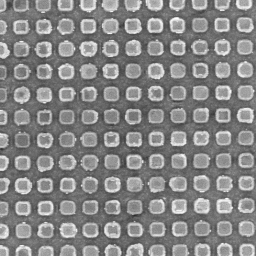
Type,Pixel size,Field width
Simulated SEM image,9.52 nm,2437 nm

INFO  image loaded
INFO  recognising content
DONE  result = a regular array of raised bodies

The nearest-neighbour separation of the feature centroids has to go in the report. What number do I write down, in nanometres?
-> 211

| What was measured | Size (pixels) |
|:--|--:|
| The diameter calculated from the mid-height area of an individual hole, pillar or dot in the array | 15.1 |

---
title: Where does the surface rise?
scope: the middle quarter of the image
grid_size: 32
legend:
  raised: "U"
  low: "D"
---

UUDDDUUUDDUUUDDDUUUDDUUUDDDUUUDD
UUDDDUUUDDUUUDDDUUUDDUUUUDDUUUDD
UUDDDUUUDDUUUUDDUUUDDUUUUDDUUUDD
UDDDDDDDDDDDUDDDDDDDDDUUDDDDDDDD
DDDDDDDDDDDDDDDDDDDDDDDDDDDDDDDD
DDDDDDDDDDDDDDDDDDDDDDDDDDDDDDDD
UUDDDUUUDDUUUUDDUUUDDUUUUDDUUUDD
UUDDDUUUDDUUUUDDUUUDDUUUUDDUUUDD
UUDDDUUUDDUUUUDDUUUDDUUUUDDUUUDD
DDDDDDDDDDDDDDDDDDDDDDDDDDDDDDDD
DDDDDDDDDDDDDDDDDDDDDDDDDDDDDDDD
DDDDDDDDDDDDDDDDUUUDDDUUDDDUUUDD
UUDDDUUUDDUUUUDUUUUDDUUUUDDUUUDD
UUDDDUUUDDUUUUDUUUUDDUUUUDDUUUDD
UUDDDUUUDDDUUDDDUUUDDDUUDDDDUUDD
DDDDDDDDDDDDDDDDDDDDDDDDDDDDDDDD
DDDDDDDDDDDDDDDDDDDDDDDDDDDDDDDD
UUDDDUUUDDUUUDDDUUUDDDUUUDDUUUDD
UUDDDUUUDDUUUUDDUUUDDUUUUDDUUUDD
UUDDDUUUDDUUUUDDUUUDDUUUUDDUUUDD
UUDDDDDDDDDUUDDDDDUDDDDDDDDDDDDD
DDDDDDDDDDDDDDDDDDDDDDDDDDDDDDDD
DDDDDDDDDDDDDDDDDDDDDDDDDDDDDDDD
UUUDDUUUDDUUUUDDUUUDDUUUUDDUUUDD
UUUDDUUUDDUUUUDDUUUDDUUUUDDUUUDD
UUUDDUUUDDUUUUDDUUUDDUUUUDDUUUDD
DDDDDDDDDDDDDDDDDDDDDDDDDDDDDDDD
DDDDDDDDDDDDDDDDDDDDDDDDDDDDDDDD
DDDDDDDDDDDUUDDDDDDDDDDDDDDDUUDD
UUUDDUUUDDUUUUDDUUUDDDUUUDUUUUUD
UUUDDUUUDDUUUUDDUUUDDDUUUDDUUUUD
UUDDDUUUDDDUUUDDUUUDDDUUDDDUUUDD